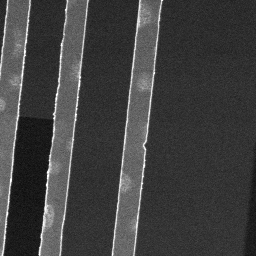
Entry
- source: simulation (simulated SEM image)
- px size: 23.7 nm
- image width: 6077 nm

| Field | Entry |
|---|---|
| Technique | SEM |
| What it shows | one or a few lines or trenches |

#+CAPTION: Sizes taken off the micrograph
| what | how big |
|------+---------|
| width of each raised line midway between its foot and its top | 504 nm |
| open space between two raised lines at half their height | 1050 nm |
